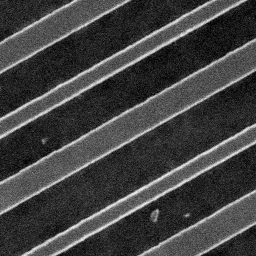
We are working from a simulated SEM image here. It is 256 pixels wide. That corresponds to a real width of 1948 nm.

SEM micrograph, lines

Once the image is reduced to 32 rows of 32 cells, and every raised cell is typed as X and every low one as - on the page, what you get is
---------XXXXXX-----------XXXX--
-------XXXXXXX----------XXXX----
-----XXXXXXX----------XXXX------
---XXXXXXX----------XXXXX-------
-XXXXXXX----------XXXXX---------
XXXXXX-----------XXXX----------X
XXXXX----------XXXX----------XXX
XXX----------XXXXX---------XXXXX
X----------XXXXX---------XXXXXXX
----------XXXX----------XXXXXXX-
--------XXXX----------XXXXXXX---
------XXXX----------XXXXXXX-----
----XXXXX---------XXXXXXXX------
--XXXXX----------XXXXXXX--------
XXXXX----------XXXXXXX----------
XXX----------XXXXXXX------------
X----------XXXXXXX------------XX
----------XXXXXXX-----------XXXX
--------XXXXXXX------------XXXX-
------XXXXXXX------------XXXX---
----XXXXXXX------------XXXX-----
--XXXXXXX------------XXXXX------
XXXXXXXX-----------XXXXX--------
XXXXXX------------XXXX----------
XXXX------------XXXX-----------X
XX------------XXXX-----------XXX
X-----------XXXXX----------XXXXX
----------XXXXX----------XXXXXXX
---------XXXX----------XXXXXXXX-
-------XXXX-----------XXXXXXX---
-----XXXXX----------XXXXXXXX----
---XXXXX----------XXXXXXXX------